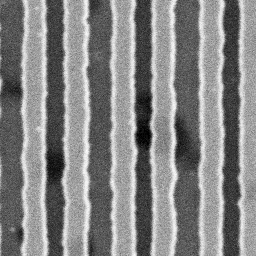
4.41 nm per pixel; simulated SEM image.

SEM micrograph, lines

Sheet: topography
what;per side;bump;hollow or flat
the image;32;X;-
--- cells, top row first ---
---XXX--XXX---XXX--XXX---XXX--XX
---XXX--XXX---XXX--XXX---XXX--XX
---XXX--XXX---XXX--XXX---XXX--XX
---XXX--XXX---XXX--XXX---XXX--XX
---XXX--XXX---XXX--XXX---XXX--XX
---XXX--XXX---XXX--XXX---XXX--XX
---XXX--XXX---XXX--XXX---XXX--XX
---XXX--XXX---XXX--XXX---XXX--XX
---XXX--XXX---XXX--XXX---XXX--XX
---XXX--XXX---XXX--XXX---XXX--XX
---XXX--XXX---XXX--XXX---XXX--XX
---XXX--XXX---XXX--XXX---XXX--XX
---XXX--XXX---XXX--XXX---XXX--XX
---XXX--XXX---XXX--XXX---XXX--XX
---XXX--XXX---XXX--XXX---XXX--XX
---XXX--XXX---XXX--XXX---XXX--XX
---XXX--XXX---XXX--XXX---XXX--XX
---XXX--XXX---XXX--XXX---XXX--XX
---XXX--XXX---XXX--XXX---XXX--XX
---XXX--XXX---XXX--XXX---XXX--XX
---XXX--XXX---XXX--XXX---XXX--XX
---XXX--XXX---XXX--XXX---XXX--XX
---XXX--XXX---XXX--XXX---XXX--XX
---XXX--XXX---XXX--XXX---XXX--XX
---XXX--XXX---XXX--XXX---XXX--XX
---XXX--XXX---XXX--XXX---XXX--XX
---XXX--XXX---XXX--XXX---XXX--XX
---XXX--XXX---XXX--XXX---XXX--XX
---XXX--XXX---XXX--XXX---XXX--XX
---XXX--XXX---XXX--XXX---XXX--XX
---XXX--XXX---XXX--XXX---XXX--XX
---XXX--XXX---XXX--XXX---XXX--XX